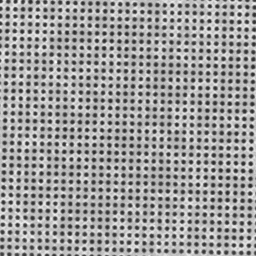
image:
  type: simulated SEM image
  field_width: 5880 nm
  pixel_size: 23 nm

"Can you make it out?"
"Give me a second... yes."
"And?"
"a regular array of holes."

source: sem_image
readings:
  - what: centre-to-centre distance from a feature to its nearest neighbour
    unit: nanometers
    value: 164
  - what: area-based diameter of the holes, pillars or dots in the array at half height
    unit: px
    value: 4.92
